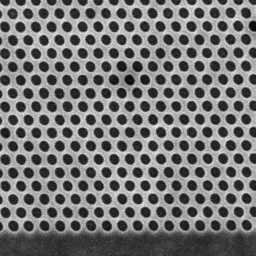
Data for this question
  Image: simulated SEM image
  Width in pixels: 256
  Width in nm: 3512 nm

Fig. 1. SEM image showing a regular array of holes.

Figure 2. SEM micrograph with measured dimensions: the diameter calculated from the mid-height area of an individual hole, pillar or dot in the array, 152 nm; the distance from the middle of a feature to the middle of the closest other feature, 208 nanometers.